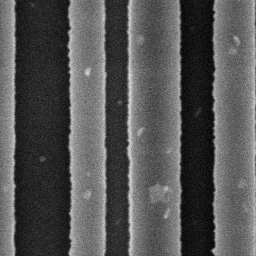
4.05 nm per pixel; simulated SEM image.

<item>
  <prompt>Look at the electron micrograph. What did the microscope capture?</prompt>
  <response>lines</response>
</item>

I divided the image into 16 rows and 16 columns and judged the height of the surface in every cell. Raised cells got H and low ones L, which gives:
HLLLHHHHHHHLLHHH
HLLLHHHHHHHLLHHH
HLLLHHHHHHHLLHHH
HLLLHHHHHHHLLHHH
HLLLHHHHHHHLLHHH
HLLLHHHHHHHLLHHH
HLLLHHHHHHHLLHHH
HLLLHHHHHHHLLHHH
HLLLHHHHHHHLLHHH
HLLLHHHHHHHLLHHH
HLLLHHHHHHHLLHHH
HLLLHHHHHHHLLHHH
HLLLHHHHHHHLLHHH
HLLLHHHHHHHLLHHH
HLLLHHHHHHHLLHHH
HLLLHHHHHHHLLHHH